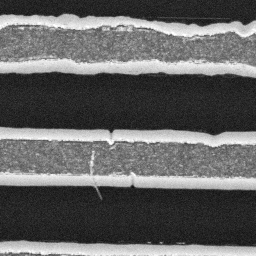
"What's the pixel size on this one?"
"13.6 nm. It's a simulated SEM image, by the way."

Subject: one or a few lines or trenches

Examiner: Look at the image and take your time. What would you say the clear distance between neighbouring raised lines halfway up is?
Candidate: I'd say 889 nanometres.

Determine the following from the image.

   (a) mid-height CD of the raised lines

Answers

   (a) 658 nanometers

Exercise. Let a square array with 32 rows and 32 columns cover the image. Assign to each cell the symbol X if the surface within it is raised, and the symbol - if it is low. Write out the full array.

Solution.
--------------------------------
--------------------------------
XXXXXX------XX------------------
XXXXXXXXXXXXXXXXXXXXXX----XXXX-X
XXXXXXXXXXXXXXXXXXXXXXXXXXXXXXXX
XXXXXXXXXXXXXXXXXXXXXXXXXXXXXXXX
XXXXXXXXXXXXXXXXXXXXXXXXXXXXXXXX
XXXXXXXXXXXXXXXXXXXXXXXXXXXXXXXX
XXX------XXXXXXXXXXXXXXXXXXXXXXX
--------------------------------
--------------------------------
--------------------------------
--------------------------------
--------------------------------
--------------------------------
--------------------------------
--------------------------------
XXXXXXXXXXXXXXXXXXXXXXXXXXXXXXXX
XXXXXXXXXXXXXXXXXXXXXXXXXXXXXXXX
XXXXXXXXXXXXXXXXXXXXXXXXXXXXXXXX
XXXXXXXXXXXXXXXXXXXXXXXXXXXXXXXX
XXXXXXXXXXXXXXXXXXXXXXXXXXXXXXXX
XXXXXXXXXXXXXXXXXXXXXXXXXXXXXXXX
--------------------------------
--------------------------------
--------------------------------
--------------------------------
--------------------------------
--------------------------------
--------------------------------
--------------------------------
XXXXXXXXXXXXXXXXXXXXXXXXXXXXXXXX